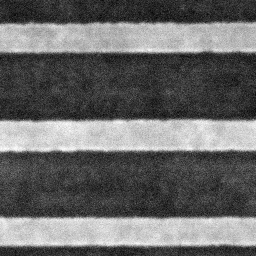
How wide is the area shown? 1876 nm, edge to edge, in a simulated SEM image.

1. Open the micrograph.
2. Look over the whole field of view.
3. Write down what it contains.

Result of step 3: lines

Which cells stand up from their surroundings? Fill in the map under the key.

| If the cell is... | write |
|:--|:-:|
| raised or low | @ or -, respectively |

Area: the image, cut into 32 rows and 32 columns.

--------------------------------
--------------------------------
--------------------------------
@@@@@@@@@@@@@@@@@@@@@@@@@@@@@@@@
@@@@@@@@@@@@@@@@@@@@@@@@@@@@@@@@
@@@@@@@@@@@@@@@@@@@@@@@@@@@@@@@@
----@---------------------------
--------------------------------
--------------------------------
--------------------------------
--------------------------------
--------------------------------
--------------------------------
--------------------------------
--------------------------------
@@@@@@@@@@@@@@@@@@@@@@@@@@@@@@@@
@@@@@@@@@@@@@@@@@@@@@@@@@@@@@@@@
@@@@@@@@@@@@@@@@@@@@@@@@@@@@@@@@
@@@@@@@@@@@@@@@@@@@@@@@@@@@@@@@@
--------------------------------
--------------------------------
--------------------------------
--------------------------------
--------------------------------
--------------------------------
--------------------------------
--------------------------------
@@@@@@@@@@@@@@@@@@@@@@@@@@@@@@@@
@@@@@@@@@@@@@@@@@@@@@@@@@@@@@@@@
@@@@@@@@@@@@@@@@@@@@@@@@@@@@@@@@
@@@@@@@@@@@-@@@@@@@@@@@@@@-@-@@@
--------------------------------